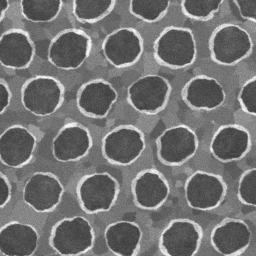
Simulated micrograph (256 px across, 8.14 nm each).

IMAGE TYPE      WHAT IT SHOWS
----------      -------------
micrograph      a regular array of holes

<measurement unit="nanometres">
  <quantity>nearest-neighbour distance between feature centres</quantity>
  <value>432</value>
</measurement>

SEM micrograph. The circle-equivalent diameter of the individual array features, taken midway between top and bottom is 306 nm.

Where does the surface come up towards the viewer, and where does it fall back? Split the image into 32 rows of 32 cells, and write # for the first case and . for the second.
.##....##.....##.....##....###..
.##....##.....###...###....###..
####..####..######.#############
############################..##
...####....###...###....###....#
....##.....##.....##....##.....#
....##.....##.....##....###....#
....##....####...###....###...##
########.#######################
################################
###....####..####....###...####.
.##.....##....##.....##.....##..
.##.....##....##.....##.....##..
.##....###....###...####...####.
###########..###################
################################
#...###....###...####...###....#
....###....##.....##.....##....#
....###....##.....##.....##....#
....###...###....###....###...##
#..##################.##########
###############################.
.###...###....###...####....##..
.##.....##.....##....##.....##..
.##....###....###....##.....##..
####...###....###...####...#####
###########.####################
########...#####################
#...###....###...####....##....#
.....##.....#....###.....##....#
.....##....##....###.....##....#
....###...####...####...###...##